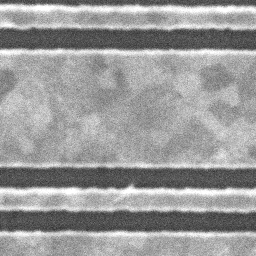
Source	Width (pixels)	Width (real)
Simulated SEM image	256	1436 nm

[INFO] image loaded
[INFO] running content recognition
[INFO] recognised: lines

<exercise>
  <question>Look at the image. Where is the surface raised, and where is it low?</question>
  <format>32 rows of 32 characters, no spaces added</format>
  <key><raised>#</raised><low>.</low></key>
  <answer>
................................
################################
################################
..#...........#####.##.....#.###
................................
................................
################################
################################
################################
################################
################################
################################
################################
################################
################################
################################
################################
################################
################################
################################
################################
................................
................................
................................
################################
################################
................................
................................
................................
################################
################################
################################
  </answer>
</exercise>